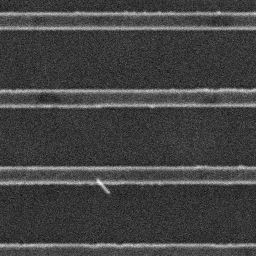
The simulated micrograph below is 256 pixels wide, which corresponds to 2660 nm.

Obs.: lines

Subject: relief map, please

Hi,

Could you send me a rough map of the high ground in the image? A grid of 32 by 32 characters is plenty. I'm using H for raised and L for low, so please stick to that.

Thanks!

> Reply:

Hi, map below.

LLLLLLLLLLLLLLLLLLLLLLLLLLLLLLLL
LLLLLLLLLLLLLLLLLLLLLLLLLLLLLLLL
HHHHHHHHHHHHHHHHHHHHHHHHHHHHHHHH
HHHHHHHHHHHHHHHHHHHHHHHHHHHHHHHH
LLLLLLLLLLLLLLLLLLLLLLLLLLLLLLLL
LLLLLLLLLLLLLLLLLLLLLLLLLLLLLLLL
LLLLLLLLLLLLLLLLLLLLLLLLLLLLLLLL
LLLLLLLLLLLLLLLLLLLLLLLLLLLLLLLL
LLLLLLLLLLLLLLLLLLLLLLLLLLLLLLLL
LLLLLLLLLLLLLLLLLLLLLLLLLLLLLLLL
LLLLLLLLLLLLLLLLLLLLLLLLLLLLLLLL
HHHHHHHHHHHHHHHHHHHHHHHHHHHHHHHH
HHHHHHHHHHHHHHHHHHHHHHHHHHHHHHHH
LLLLLLLLLLLLLLLLLLLLLLLLLLLLLLLL
LLLLLLLLLLLLLLLLLLLLLLLLLLLLLLLL
LLLLLLLLLLLLLLLLLLLLLLLLLLLLLLLL
LLLLLLLLLLLLLLLLLLLLLLLLLLLLLLLL
LLLLLLLLLLLLLLLLLLLLLLLLLLLLLLLL
LLLLLLLLLLLLLLLLLLLLLLLLLLLLLLLL
LLLLLLLLLLLLLLLLLLLLLLLLLLLLLLLL
LLLLLLLLLLLLLLLLLLLLLLLLLLLLLLLL
HHHHHHHHHHHHHHHHHHHHHHHHHHHHHHHH
HHHHHHHHHHHHHHHHHHHHHHHHHHHHHHHH
LLLLLLLLLLLLLLLLLLLLLLLLLLLLLLLL
LLLLLLLLLLLLLLLLLLLLLLLLLLLLLLLL
LLLLLLLLLLLLLLLLLLLLLLLLLLLLLLLL
LLLLLLLLLLLLLLLLLLLLLLLLLLLLLLLL
LLLLLLLLLLLLLLLLLLLLLLLLLLLLLLLL
LLLLLLLLLLLLLLLLLLLLLLLLLLLLLLLL
LLLLLLLLLLLLLLLLLLLLLLLLLLLLLLLL
LLLLLLLLLLLLLLLLLLLLLLLLLLLLLLLL
HHHHHHHHHHHHHHHHHHHHHHHHHHHHHHHH